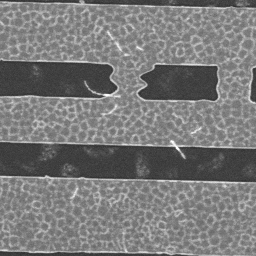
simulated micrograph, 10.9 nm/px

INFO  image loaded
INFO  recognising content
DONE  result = one or a few lines or trenches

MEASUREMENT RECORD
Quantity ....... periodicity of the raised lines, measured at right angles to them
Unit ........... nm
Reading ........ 995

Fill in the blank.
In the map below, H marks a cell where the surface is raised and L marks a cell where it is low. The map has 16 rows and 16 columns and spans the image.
HHHHHHHHHHHHHHHH
HHHHHHHHHHHHHHHH
HHHHHHHHHHHHHHHH
HHHHHHHHHHHHHHHH
LLLLLLLHHLLLLLHH
LLLLLLLHHLLLLLHH
HHHHHHHHHHHHHHHH
HHHHHHHHHHHHHHHH
HHHHHHHHHHHHHHHH
LLLLLLLLLLLLLLLL
LLLLLLLLLLLLLLLL
HHHHHHHHHHHHHHHH
HHHHHHHHHHHHHHHH
HHHHHHHHHHHHHHHH
HHHHHHHHHHHHHHHH
HHHHHHHHHHHHHHHH